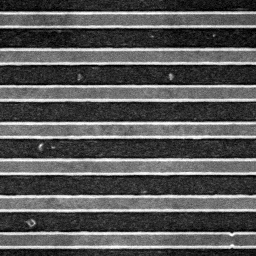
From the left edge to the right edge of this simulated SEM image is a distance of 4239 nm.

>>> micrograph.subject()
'parallel lines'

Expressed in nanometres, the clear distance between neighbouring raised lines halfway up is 364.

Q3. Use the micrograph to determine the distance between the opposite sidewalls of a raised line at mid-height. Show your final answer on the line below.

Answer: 252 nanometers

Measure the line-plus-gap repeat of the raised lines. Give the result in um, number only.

0.608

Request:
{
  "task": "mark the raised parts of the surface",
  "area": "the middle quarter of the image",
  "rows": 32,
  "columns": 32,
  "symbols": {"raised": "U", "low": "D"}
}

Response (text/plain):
DDDDDDDDDDDDDDDDDDDDDDDDDDDDDDDD
DDDDDDDDDDDDDDDDDDDDDDDDDDDDDDDD
DDDDDDDDDDDDDDDDDDDDDDDDDDDDDDDD
DDDDDDDDDDDDDDDDDDDDDDDDDDDDDDDD
DDDDDDDDDDDDDDDDDDDDDDDDDDDDDDDD
DDDDDDDDDUUDDDDDDDDDUUDDDDDDDDDD
UUUUUUUUUUUUUUUUUUUUUUUUUUUUUUUU
UUUUUUUUUUUUUUUUUUUUUUUUUUUUUUUU
UUUUUUUUUUUUUUUUUUUUUUUUUUUUUUUU
DDDDDDDDDDDDDDDDDDDDDDDDDDDDDDDD
DDDDDDDDDDDDDDDDDDDDDDDDDDDDDDDD
DDDDDDDDDDDDDDDDDDDDDDDDDDDDDDDD
DDDDDDDDDDDDDDDDDDDDDDDDDDDDDDDD
DDDDDDDDDDDDDDDDDDDDDDDDDDDDDDDD
DDDDDDDDDDDDDDDDDDDDDDDDDDDDDDDD
UUUUUUUUUUUUUUUUUUUUUUUUUUUUUUUU
UUUUUUUUUUUUUUUUUUUUUUUUUUUUUUUU
UUUUUUUUUUUUUUUUUUUUUUUUUUUUUUUU
DDDDDDDDDDDDDDDDDDDDDDDDDDDDDDDD
DDDDDDDDDDDDDDDDDDDDDDDDDDDDDDDD
DDDDDDDDDDDDDDDDDDDDDDDDDDDDDDDD
DDDDDDDDDDDDDDDDDDDDDDDDDDDDDDDD
DDDDDDDDDDDDDDDDDDDDDDDDDDDDDDDD
DDDDDDDDDDDDDDDDDDDDDDDDDDDDDDDD
UUUUUUUUUUUUUUUUUUUUUUUUUUUUUUUU
UUUUUUUUUUUUUUUUUUUUUUUUUUUUUUUU
UUUUUUUUUUUUUUUUUUUUUUUUUUUUUUUU
DDDDDDDDDDDDDDDDDDDDDDDDUDDDDDDD
DDDDDDDDDDDDDDDDDDDDDDDDDDDDDDDD
DDDDDDDDDDDDDDDDDDDDDDDDDDDDDDDD
DDDDDDDDDDDDDDDDDDDDDDDDDDDDDDDD
DDDDDDDDDDDDDDDDDDDDDDDDDDDDDDDD